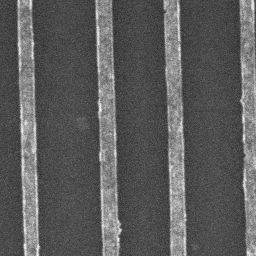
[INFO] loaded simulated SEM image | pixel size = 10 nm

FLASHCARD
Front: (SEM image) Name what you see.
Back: one or a few lines or trenches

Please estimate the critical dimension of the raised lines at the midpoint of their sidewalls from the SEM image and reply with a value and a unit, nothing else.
0.143 µm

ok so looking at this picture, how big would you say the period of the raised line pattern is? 0.738 µm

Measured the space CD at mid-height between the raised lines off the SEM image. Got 0.609 micrometres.